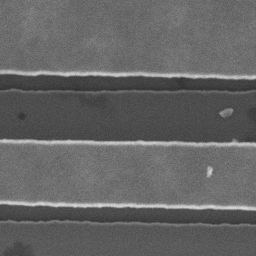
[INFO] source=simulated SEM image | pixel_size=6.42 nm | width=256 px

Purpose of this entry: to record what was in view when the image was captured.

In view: lines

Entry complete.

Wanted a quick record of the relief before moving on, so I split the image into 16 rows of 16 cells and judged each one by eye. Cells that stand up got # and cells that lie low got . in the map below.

################
################
################
################
################
................
................
................
................
################
################
################
################
................
................
................